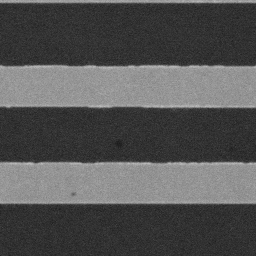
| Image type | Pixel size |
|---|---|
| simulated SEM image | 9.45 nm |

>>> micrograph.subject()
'lines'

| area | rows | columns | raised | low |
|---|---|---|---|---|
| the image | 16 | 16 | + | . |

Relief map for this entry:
................
................
................
................
++++++++++++++++
++++++++++++++++
++++++++++++++++
................
................
................
++++++++++++++++
++++++++++++++++
++++++++++++++++
................
................
................